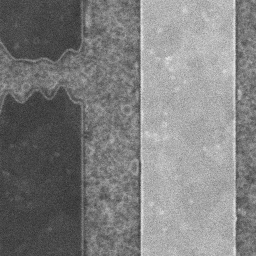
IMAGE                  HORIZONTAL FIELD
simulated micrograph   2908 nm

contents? one or a few lines or trenches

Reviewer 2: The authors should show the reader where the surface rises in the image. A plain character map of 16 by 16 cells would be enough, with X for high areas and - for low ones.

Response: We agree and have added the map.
XXXXX----XXXXXX-
XXXXX----XXXXXX-
XXXXX----XXXXXX-
-XXX-----XXXXXX-
---------XXXXXX-
---------XXXXXX-
XXXXX----XXXXXX-
XXXXX----XXXXXX-
XXXXX----XXXXXX-
XXXXX----XXXXXX-
XXXXX---XXXXXXX-
XXXXX----XXXXXX-
XXXXX----XXXXXX-
XXXXX----XXXXXX-
XXXXX----XXXXXX-
XXXXX----XXXXXX-